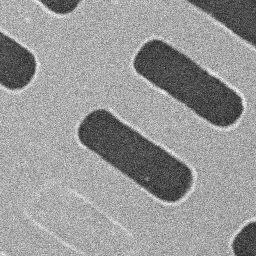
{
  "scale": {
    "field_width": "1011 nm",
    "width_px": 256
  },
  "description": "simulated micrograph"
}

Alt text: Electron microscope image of holes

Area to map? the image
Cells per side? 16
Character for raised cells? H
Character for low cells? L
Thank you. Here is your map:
HHHLLHHHHHHHLLLL
HHHHHHHHHHHHHHLL
LHHHHHHHHHHHHHHL
LLHHHHHHHLLLHHHH
LLHHHHHHHLLLLHHH
LHHHHHHHHHLLLLHH
HHHHHHHHHHHLLLLH
HHHHHLLHHHHHHLLH
HHHHHLLLLHHHHHHH
HHHHHHLLLLHHHHHH
HHHHHHHLLLLLHHHH
HHHHHHHHHLLLHHHH
HHHHHHHHHHLHHHHH
HHHHHHHHHHHHHHHH
HHHHHHHHHHHHHHHL
HHHHHHHHHHHHHHHL